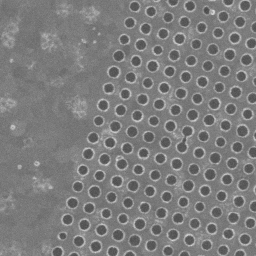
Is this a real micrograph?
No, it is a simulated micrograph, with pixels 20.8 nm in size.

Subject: a regular array of holes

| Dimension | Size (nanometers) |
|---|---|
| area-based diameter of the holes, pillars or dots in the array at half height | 215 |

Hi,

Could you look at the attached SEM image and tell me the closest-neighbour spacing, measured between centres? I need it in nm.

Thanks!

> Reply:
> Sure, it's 353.